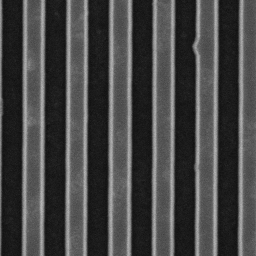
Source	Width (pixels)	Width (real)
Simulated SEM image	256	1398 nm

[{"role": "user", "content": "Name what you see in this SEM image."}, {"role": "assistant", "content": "parallel lines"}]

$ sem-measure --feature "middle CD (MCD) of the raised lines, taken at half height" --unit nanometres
107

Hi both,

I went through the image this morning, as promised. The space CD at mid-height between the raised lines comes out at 132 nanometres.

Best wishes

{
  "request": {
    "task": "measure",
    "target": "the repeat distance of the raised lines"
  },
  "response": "236 nanometres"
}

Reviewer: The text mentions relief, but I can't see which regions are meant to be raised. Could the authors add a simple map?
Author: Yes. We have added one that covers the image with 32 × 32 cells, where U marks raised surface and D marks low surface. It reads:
DDDUUDDDDUUDDDUUDDDUUUDDDUUDDDUU
DDDUUDDDDUUDDDUUDDDUUUDDDUUDDDUU
DDDUUDDDDUUDDDUUDDDUUUDDDUUDDDUU
DDDUUDDDDUUDDDUUDDDUUUDDDUUDDDUU
DDDUUDDDDUUDDDUUDDDUUUDDDUUDDDUU
DDDUUDDDDUUDDDUUDDDUUUDDUUUDDDUU
DDDUUDDDDUUDDDUUDDDUUUDDUUUDDDUU
DDDUUDDDDUUDDDUUDDDUUUDDDUUDDDUU
DDDUUDDDDUUDDDUUDDDUUUDDDUUDDDUU
DDDUUDDDDUUDDDUUDDDUUUDDDUUDDDUU
DDDUUDDDUUUDDDUUDDDUUUDDDUUDDDUU
DDDUUDDDUUUDDDUUDDDUUUDDDUUDDDUU
DDDUUDDDUUUDDDUUDDDUUUDDDUUDDDUU
DDDUUDDDUUUDDDUUDDDUUUDDDUUDDDUU
DDDUUDDDUUUDDDUUDDDUUUDDDUUDDDUU
DDDUUDDDUUUDDDUUDDDUUUDDDUUDDDUU
DDDUUDDDUUUDDDUUDDDUUUDDDUUDDDUU
DDDUUDDDUUUDDDUUDDDUUUDDDUUDDDUU
DDDUUDDDUUUDDDUUDDDUUUDDDUUDDDUU
DDDUUDDDUUUDDDUUDDDUUUDDDUUDDDUU
DDDUUDDDUUUDDDUUDDDUUUDDDUUDDDUU
DDDUUDDDUUUDDDUUDDDUUUDDDUUDDDUU
DDDUUDDDUUUDDDUUDDDUUUDDDUUDDDUU
DDDUUDDDUUUDDDUUDDDUUUDDDUUDDDUU
DDDUUDDDUUUDDDUUDDDUUUDDDUUDDDUU
DDDUUDDDUUUDDDUUDDDUUUDDDUUDDDUU
DDDUUDDDUUUDDDUUDDDUUUDDDUUDDDUU
DDDUUDDDUUUDDDUUDDDUUUDDDUUDDDUU
DDDUUDDDUUUDDDUUDDDUUUDDDUUDDDUU
DDDUUDDDUUUDDDUUDDDUUDDDDUUDDDUU
DDDUUDDDUUUDDDUUDDDUUUDDDUUDDDUU
DDDUUDDDUUUDDDUUDDDUUUDDDUUDDDUU